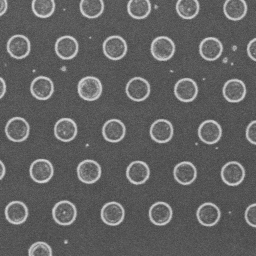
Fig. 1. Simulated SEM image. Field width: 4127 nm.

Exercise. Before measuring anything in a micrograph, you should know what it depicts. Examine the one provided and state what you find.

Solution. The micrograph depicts a regular array of raised bodies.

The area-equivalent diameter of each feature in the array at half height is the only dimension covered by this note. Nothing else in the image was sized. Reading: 354 nm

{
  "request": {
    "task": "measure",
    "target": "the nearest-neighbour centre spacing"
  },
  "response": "764 nm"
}